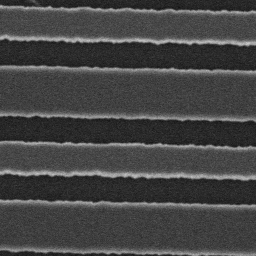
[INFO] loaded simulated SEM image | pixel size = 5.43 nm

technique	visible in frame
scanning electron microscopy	lines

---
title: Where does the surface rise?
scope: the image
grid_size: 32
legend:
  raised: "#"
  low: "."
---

................................
################################
################################
################################
################################
.......................#...#.###
................................
................................
#########.#.....................
################################
################################
################################
################################
################################
...#.###########################
................................
................................
................................
################################
################################
################################
################################
................................
................................
................................
#######################.........
################################
################################
################################
################################
################################
.....#..########################